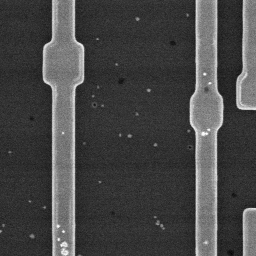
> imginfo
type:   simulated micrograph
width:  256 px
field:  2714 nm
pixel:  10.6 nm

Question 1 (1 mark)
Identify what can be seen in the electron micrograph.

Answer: wiring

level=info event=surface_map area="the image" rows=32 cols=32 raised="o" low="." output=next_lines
.......oo...............ooo...oo
.......oo...............ooo...oo
.......oo...............ooo...oo
.......oo...............ooo...oo
.......oo...............ooo...oo
......oooo..............ooo...oo
.....ooooo..............ooo...oo
.....ooooo..............ooo...oo
.....ooooo...............oo...oo
.....ooooo...............oo...oo
......oooo..............ooo...oo
.......oo...............ooo...oo
.......oo...............oooo..oo
.......oo...............oooo..oo
.......oo...............oooo....
.......oo...............oooo....
.......oo...............ooo.....
.......oo...............ooo.....
.......oo...............ooo.....
.......oo...............ooo.....
.......oo...............ooo.....
.......oo...............ooo.....
.......oo...............ooo.....
.......oo...............ooo.....
.......oo...............ooo.....
.......oo...............ooo.....
.......oo...............ooo....o
.......oo...............ooo...oo
.......oo...............ooo...oo
.......oo...............ooo...oo
.......oo...............ooo...oo
.......oo...............ooo...oo